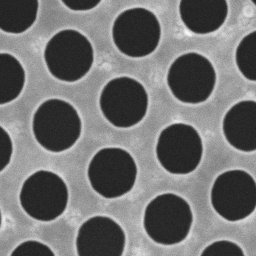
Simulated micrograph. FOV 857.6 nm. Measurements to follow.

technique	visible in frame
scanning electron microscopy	a regular array of holes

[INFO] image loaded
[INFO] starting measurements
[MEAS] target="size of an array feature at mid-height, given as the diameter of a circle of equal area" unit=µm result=0.163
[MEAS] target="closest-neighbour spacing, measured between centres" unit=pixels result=71.3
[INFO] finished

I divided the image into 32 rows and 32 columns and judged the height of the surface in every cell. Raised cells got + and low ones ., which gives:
.....+++....+++++++++++.....++++
.....++++++++++....+++......++++
....++++++++++......+++.....++++
...+++++++++++......++++...+++++
+++++++...++++......+++++++++++.
++++++.....+++......++++++++++..
++++++......+++....+++++++++++..
..++++......++++++++++....++++..
...+++.....++++++++++......+++..
...++++...+++++++++++......++++.
...++++++++++....++++......+++++
...++++++++++.....++++....++++++
..++++.++++++.....++++....++++++
+++++....++++.....+++++++++++...
++++......+++.....++++++++++....
++++......++++...+++++.+++++....
.+++......++++++++++.....+++....
.++++.....++++++++++.....+++....
..++++...+++++.+++++.....+++++..
.+++++++++++....++++.....+++++++
.++++++++++......+++.....+++++++
+++++.+++++......++++...++++...+
+++.....+++......++++++++++.....
+++.....++++....+++++++++++.....
+++.....+++++..+++++..++++......
+++.....+++++++++++....++++.....
+++.....++++++++++......+++.....
+++++.+++++...++++......++++..++
++++++++++.....+++......++++++++
++++++++++......+++....+++++++++
+++..+++++......+++++.++++...+++
++.....+++.....++++++++++.....++